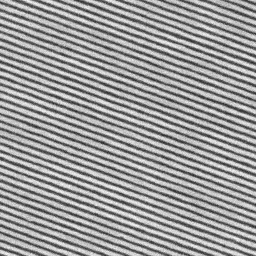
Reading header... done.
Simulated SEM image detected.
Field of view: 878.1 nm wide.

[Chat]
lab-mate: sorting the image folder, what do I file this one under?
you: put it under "parallel lines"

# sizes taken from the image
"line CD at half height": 0.013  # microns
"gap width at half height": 11.8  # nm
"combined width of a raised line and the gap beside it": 24.1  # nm